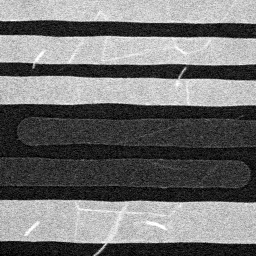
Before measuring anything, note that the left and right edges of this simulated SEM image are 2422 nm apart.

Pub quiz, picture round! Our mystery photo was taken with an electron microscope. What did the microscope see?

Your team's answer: groups of lines, slits or small figures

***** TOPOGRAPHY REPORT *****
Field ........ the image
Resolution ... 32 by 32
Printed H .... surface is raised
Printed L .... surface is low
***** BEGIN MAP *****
HHHHHHHHHHHHHHHHHHHHHHHHHHHHHHHH
HHHHHHHHHHHHHHHHHHHHHHHHHHHHHHHH
HHHHLLLLHHHHHHHHHHHHHHHHHHHHHHHH
LLLLLLLLLLLLLLLLLLLLLLLLLLLLLLLL
LLLLLLLLLLLLLLLLLLLLLLLLLLLLLLLL
HHHHHHHHHHHHHHHHHHHHHHHHHHHHHHHH
HHHHHHHHHHHHHHHHHHHHHHHHHHHHHHHH
HHHHHHHHHHHHHHHHHHHHHHHHHHHHHHHH
LLLLLLLLLLLLLLLLLLLLLLLLLLLLLLLL
LLLLLLLLLLLLLLLLLLLLLLLLLLLLLLLL
HHHHHHHHHHHHHHHHHHHHHHHHHHHHHHHH
HHHHHHHHHHHHHHHHHHHHHHHHHHHHHHHH
HHHHHHHHHHHHHHHHHHHHHHHHHHHHHHHH
LLLLLLLLLLLLLLLLLLLLLLLLLLLLLLLL
LLLLLLLLLLLLLLLLLLLLLLLLLLLLLLLL
LLHHHHHHHHHHHHHHHHHHHHHHHHHHHHHH
LLHHHHHHHHHHHHHHHHHHHHHHHHHHHHHH
LLLHHHHHHHHHHHHHHHHHHHHHHHHHHHHH
LLLLLLLLLLLLLLLLLLLLLLLLLLLLLLLL
LLLLLLLLLLLLLLLLLLLLLLLLLLLLLLLL
HHHHHHHHHHHHHHHHHHHHHHHHHHHHHHHL
HHHHHHHHHHHHHHHHHHHHHHHHHHHHHHHL
HHHHHHHHHHHHHHHHHHHHHHHHHHHHHHHL
LLLLLLLLLLLLLLLLLLLLLLLLLLLLLLLL
LLLLLLLLLLLLLLLLLLLLLLLLLLLLLLLL
HHHHHHHHHHHHHHHHHHHHHHHHHHHHHHHH
HHHHHHHHHHHHHHHHHHHHHHHHHHHHHHHH
HHHHHHHHHHHHHHHHHHHHHHHHHHHHHHHH
HHHHHHHHHHHHHHHHHHHHHHHHHHHHHHHH
HHHHHHHHHHHHHHHHHHHHHHHHHHHHHHHH
LLLLLLLLLLLLLLLLLLLLLLLLLLLLLLLL
LLLLLLLLLLLLLLLLLLLLLLLLLLLLLLLL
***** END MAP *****